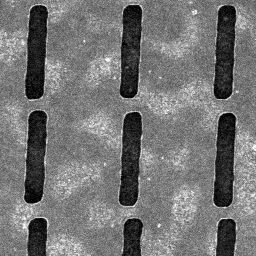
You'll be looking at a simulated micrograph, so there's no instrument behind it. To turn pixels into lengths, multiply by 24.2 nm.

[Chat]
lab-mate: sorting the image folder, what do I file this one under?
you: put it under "holes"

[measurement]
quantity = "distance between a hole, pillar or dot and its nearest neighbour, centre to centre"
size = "2280 nm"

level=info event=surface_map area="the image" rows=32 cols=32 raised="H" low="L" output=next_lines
HHHHHHHHHHHHHHHHHHHHHHHHHHHHHHHH
HHHHLLHHHHHHHHHLLLHHHHHHHHHLLLHH
HHHHLLHHHHHHHHHLLLHHHHHHHHHLLHHH
HHHLLLHHHHHHHHHLLLHHHHHHHHHLLHHH
HHHLLLHHHHHHHHHLLLHHHHHHHHHLLHHH
HHHLLLHHHHHHHHHLLLHHHHHHHHHLLHHH
HHHLLLHHHHHHHHHLLLHHHHHHHHHLLHHH
HHHLLLHHHHHHHHHLLHHHHHHHHHHLLHHH
HHHLLLHHHHHHHHHLLHHHHHHHHHHLLHHH
HHHLLLHHHHHHHHHLLHHHHHHHHHHLLHHH
HHHLLLHHHHHHHHHLLHHHHHHHHHHLLHHH
HHHLLHHHHHHHHHHLLHHHHHHHHHHLLHHH
HHHHHHHHHHHHHHHHHHHHHHHHHHHHHHHH
HHHHHHHHHHHHHHHHHHHHHHHHHHHHHHHH
HHHHLLHHHHHHHHHHLLHHHHHHHHHHLHHH
HHHLLLHHHHHHHHHLLLHHHHHHHHHLLLHH
HHHLLLHHHHHHHHHLLLHHHHHHHHHLLHHH
HHHLLLHHHHHHHHHLLLHHHHHHHHHLLHHH
HHHLLLHHHHHHHHHLLLHHHHHHHHHLLHHH
HHHLLLHHHHHHHHHLLLHHHHHHHHHLLHHH
HHHLLLHHHHHHHHHLLHHHHHHHHHHLLHHH
HHHLLLHHHHHHHHHLLLHHHHHHHHHLLHHH
HHHLLLHHHHHHHHHLLHHHHHHHHHHLLHHH
HHHLLHHHHHHHHHHLLHHHHHHHHHHLLHHH
HHHLLHHHHHHHHHHLLHHHHHHHHHHLLHHH
HHHHHHHHHHHHHHHLLHHHHHHHHHHLLHHH
HHHHHHHHHHHHHHHHHHHHHHHHHHHHHHHH
HHHHLLHHHHHHHHHHLLHHHHHHHHHHLHHH
HHHLLLHHHHHHHHHLLLHHHHHHHHHLLHHH
HHHLLLHHHHHHHHHLLLHHHHHHHHHLLHHH
HHHLLLHHHHHHHHHLLLHHHHHHHHHLLHHH
HHHLLLHHHHHHHHHLLLHHHHHHHHHLLHHH